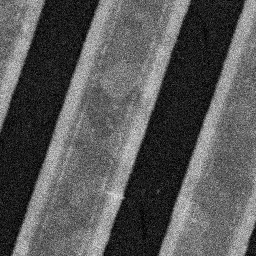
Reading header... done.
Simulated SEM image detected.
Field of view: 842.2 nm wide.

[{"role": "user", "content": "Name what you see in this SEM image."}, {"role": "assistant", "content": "one or a few lines or trenches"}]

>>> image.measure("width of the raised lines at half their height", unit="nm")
231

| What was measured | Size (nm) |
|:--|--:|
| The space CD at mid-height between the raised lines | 223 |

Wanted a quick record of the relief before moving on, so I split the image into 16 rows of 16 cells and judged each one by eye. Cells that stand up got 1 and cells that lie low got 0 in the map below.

1100000111100000
1100001111100001
1000001111000001
1000001111000001
1000011111000011
0000011110000011
0000111110000011
0000111110000111
0000111100000111
0001111100000111
0001111100001111
0001111000001111
0011111000001111
0011111000011111
0011110000011110
0111110000011110